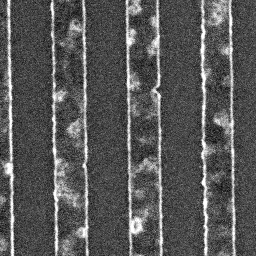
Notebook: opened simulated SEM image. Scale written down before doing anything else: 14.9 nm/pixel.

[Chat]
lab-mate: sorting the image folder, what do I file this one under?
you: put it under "one or a few lines or trenches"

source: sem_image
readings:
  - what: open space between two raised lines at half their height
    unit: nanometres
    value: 636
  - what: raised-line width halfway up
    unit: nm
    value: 469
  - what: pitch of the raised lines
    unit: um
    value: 1.1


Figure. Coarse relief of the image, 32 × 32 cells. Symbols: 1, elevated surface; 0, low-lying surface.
10000011110000001111000001111000
10000001111000001111000001111000
10000001111000001111000001111000
10000001111000001111000001111000
10000001111000001111000001111000
10000001111000001111000001111000
10000001111000001111000001111000
10000001111000001111000001111000
10000001111000001111000001111000
10000001111000001111000001111000
10000001111000001111000001111000
10000001111000001111000001111000
10000001111000001111000001111000
10000001111000001111000001111000
10000001111000001111000001111000
10000001111000001111000001111000
10000001111000001111000001111000
10000001111000001111000001111000
10000001111000001111000001111000
10000001111000001111000001111000
10000001111000001111000001111000
10000001111000001111000001111000
10000001111000001111000000111000
11000001111000001111000000111000
11000001111000001111000000111000
11000001111000001111000000111000
11000001111000001111000000111000
11000001111000001111000000111000
10000001111000001111000000111000
10000001111000001111000000111000
11000001111000001111000000111000
11000001111000001111000000111000